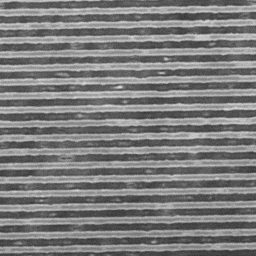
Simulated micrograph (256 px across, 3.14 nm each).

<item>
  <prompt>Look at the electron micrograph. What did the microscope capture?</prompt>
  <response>parallel lines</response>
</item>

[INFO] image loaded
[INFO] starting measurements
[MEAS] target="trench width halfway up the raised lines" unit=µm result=0.0263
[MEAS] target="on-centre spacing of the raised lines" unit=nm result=43.9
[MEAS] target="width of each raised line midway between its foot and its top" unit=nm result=17.3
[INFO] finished